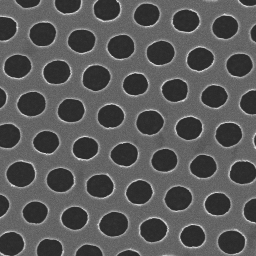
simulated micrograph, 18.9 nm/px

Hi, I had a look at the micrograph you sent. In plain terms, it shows a regular array of holes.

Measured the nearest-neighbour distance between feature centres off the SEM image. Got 752 nanometres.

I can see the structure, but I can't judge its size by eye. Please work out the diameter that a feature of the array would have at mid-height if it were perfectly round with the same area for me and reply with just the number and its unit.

0.472 um